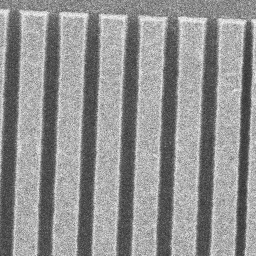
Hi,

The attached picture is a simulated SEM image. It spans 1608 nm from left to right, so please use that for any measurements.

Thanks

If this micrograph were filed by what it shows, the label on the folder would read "parallel lines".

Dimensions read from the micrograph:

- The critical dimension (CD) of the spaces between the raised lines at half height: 84.7 nm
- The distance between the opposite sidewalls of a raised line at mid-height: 164 nanometres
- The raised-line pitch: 0.249 um